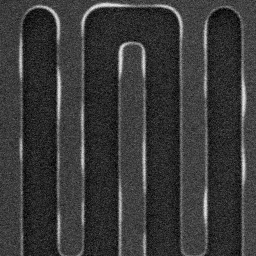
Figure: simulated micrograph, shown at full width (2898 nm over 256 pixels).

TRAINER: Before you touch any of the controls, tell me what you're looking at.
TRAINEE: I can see groups of lines, slits or small figures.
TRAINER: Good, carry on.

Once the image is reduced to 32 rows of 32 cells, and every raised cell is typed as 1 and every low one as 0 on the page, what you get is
11111111111111111111111111111111
11100001111000000000001111100111
11100001110000000000001111000011
11100001110000000000000111000011
11100001110000000000000111000011
11100001110000001000000111000011
11100001110000011100000111000011
11100001110000011100000111000011
11100001110000011100000111000011
11100001110000011100000111000011
11100001110000011100000111000011
11100001110000011100000111000011
11100001110000011100000111000001
11100001110000011100000111000011
11100001110000011100000111000011
11100001110000011100000111000011
11100001110000011100000111000011
11100001110000011100000111000011
11100001110000011100000111000011
11100001110000011100000111000011
11100001110000011100000111000011
11100001110000011100000111000011
11100001110000011100000111000011
11100001110000011100000111000011
11100001110000011100000111000011
11100001110000011100000111000011
11100001110000011100000111000011
11100001110000011100000111000011
11100001110000011100000111000011
11100001110000011100000111000011
11100001110000011100000111000011
11100001110000011100000111000011